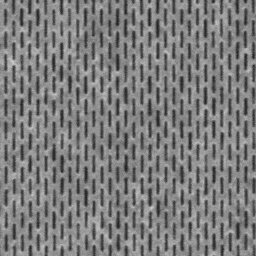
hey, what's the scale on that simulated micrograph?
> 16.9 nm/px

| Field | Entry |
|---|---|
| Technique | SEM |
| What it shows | a regular array of holes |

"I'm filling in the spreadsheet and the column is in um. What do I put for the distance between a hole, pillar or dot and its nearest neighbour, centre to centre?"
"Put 0.227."